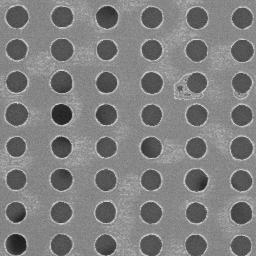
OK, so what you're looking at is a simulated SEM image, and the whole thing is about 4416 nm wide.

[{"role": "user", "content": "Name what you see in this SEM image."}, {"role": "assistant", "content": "a regular array of holes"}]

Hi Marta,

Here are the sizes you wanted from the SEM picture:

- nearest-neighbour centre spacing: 560 nanometres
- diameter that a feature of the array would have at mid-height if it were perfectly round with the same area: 381 nanometres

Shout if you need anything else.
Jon